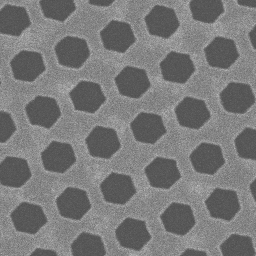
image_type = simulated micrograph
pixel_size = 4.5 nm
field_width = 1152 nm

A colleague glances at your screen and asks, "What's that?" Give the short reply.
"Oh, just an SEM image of a regular array of holes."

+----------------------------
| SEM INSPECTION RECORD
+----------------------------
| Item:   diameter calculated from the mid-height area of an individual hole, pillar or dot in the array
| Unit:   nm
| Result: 148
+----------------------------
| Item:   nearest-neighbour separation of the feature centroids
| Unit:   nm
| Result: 211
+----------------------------